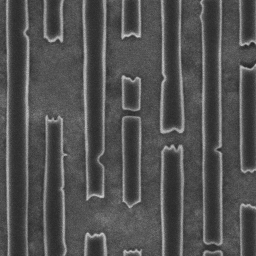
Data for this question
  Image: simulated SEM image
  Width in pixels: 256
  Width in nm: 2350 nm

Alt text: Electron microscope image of parallel lines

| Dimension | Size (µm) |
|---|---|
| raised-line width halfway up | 0.168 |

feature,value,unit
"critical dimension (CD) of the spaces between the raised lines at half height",187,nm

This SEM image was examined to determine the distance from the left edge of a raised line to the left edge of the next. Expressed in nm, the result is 357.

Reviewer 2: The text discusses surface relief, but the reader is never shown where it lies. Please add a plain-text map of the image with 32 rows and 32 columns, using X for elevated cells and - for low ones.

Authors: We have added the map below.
-XX---XX---XX--XX---XXX--XXX--XX
-XX---XX---XX--XX---XXX--XXX--XX
-XX---XX---XX--XX---XXX--XXX--XX
-XX---XX---XX--XX---XX---XXX--XX
-XX---XX---XX-------XX---XXX--XX
-XXX-------XX-------XX---XXX--X-
-XXX-------XX-------XX---XX-----
-XXX-------XX-------XX---XX-----
-XX--------XX-------XXX--XX---XX
-XX--------XX--------XX--XX---XX
-XX--------XX--XX---XXX--XX---XX
-XX--------XX--XX---XXX--XX---XX
-XX--------XX--XX---XXX--XX---XX
-XX--------XX---X---XXX--XXX--XX
-XX--------XX-------XXX--XXX--XX
-XX---XX---XX--XX---XXX--XXX--XX
-XX---XX---XX--XX--------XX---XX
-XX---XX---XX--XX--------XX---XX
-XX---XX---XX--XX----X---XX---XX
-XX---XX---XX--XX---XXX--XXX--XX
-XX---XX---XX--XX---XXX--XXX--XX
-XX---XX---XX--XX---XXX--XXX----
-XX---XX---XX--XXX--XXX--XXX----
-XX---XX---XX---XX--XXX--XXX----
-XX---XX---X----XX--XXX--XXX----
-XX---XX--------X---XXX---XX----
-XX---XX------------XXX---XX--XX
-XX---XX------------XXX---XX--XX
-XX---XX------------XXX---XX--XX
-XX---XX---XX-------XXX---XX--XX
-XX---XX---XX-------XXX-------XX
-XX---XX---XX---X---XXX-------XX